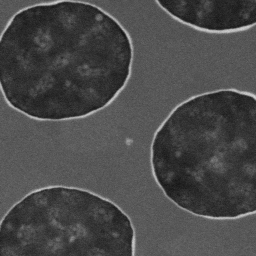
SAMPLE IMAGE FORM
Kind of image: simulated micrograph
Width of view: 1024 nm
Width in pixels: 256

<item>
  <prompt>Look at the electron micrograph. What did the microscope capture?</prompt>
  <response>holes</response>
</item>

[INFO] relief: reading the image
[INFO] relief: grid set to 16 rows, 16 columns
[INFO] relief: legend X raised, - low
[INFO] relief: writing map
XX----XXXX------
X------XXXXX----
--------XXXXXXXX
--------XXXXXXXX
--------XXXXXXXX
--------XXXXXXXX
X------XXXX-----
XXXXXXXXXX------
XXXXXXXXXX------
XXXXXXXXXX------
XXXXXXXXXX------
XXXXXXXXXX------
X------XXXX-----
--------XXXXX--X
--------XXXXXXXX
--------XXXXXXXX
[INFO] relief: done